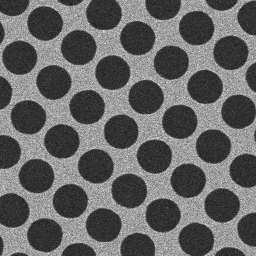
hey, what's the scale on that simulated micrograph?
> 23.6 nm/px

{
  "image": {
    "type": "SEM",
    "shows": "a regular array of holes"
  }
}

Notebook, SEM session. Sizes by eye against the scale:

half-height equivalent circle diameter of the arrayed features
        834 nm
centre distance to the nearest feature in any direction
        983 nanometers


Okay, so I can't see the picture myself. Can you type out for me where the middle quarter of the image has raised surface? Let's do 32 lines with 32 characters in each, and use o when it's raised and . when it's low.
oooooooo........oooooo.........o
.ooooooo.........oooooo........o
.ooooooo.........oooooo.......oo
..oooooo........ooooooooo....oo.
..oooooo........oo....ooooooooo.
..ooooooo......oo.......ooooooo.
.oooo..ooooooooo........ooooooo.
.oo......ooooooo.........oooooo.
oo........oooooo.........ooooooo
o.........oooooo.........ooooooo
o.........oooooo........ooo....o
o.........ooooooo.......oo......
oo........oooo.oooo...ooo.......
oo.......ooo.....oooooooo.......
ooo.....ooo.......oooooo........
..oooooooo........ooooooo.......
...ooooooo.........oooooo.......
....oooooo.........ooooooo......
....oooooo........ooooooooo...oo
....ooooooo.......oo.....ooooooo
....oooooooo.....oo.......oooooo
...oooo...oooooooo.........ooooo
...oo......ooooooo.........ooooo
.ooo........oooooo.........ooooo
oooo........oooooo.........ooooo
ooo.........ooooooo.......ooo...
oooo........oooooooo......oo....
oooo........ooo..ooooo.oooo.....
ooooo......oo......oooooooo.....
oooooo....oo........ooooooo.....
....oooooooo.........oooooo.....
.....ooooooo.........oooooo.....